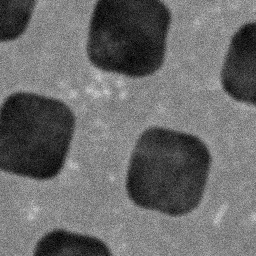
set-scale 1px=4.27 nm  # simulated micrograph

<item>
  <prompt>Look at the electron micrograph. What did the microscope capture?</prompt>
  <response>holes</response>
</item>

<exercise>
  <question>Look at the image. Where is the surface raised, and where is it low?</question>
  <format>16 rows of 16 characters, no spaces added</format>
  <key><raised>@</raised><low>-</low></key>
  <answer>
--@@@@----@@@@@@
--@@@@-----@@@@-
-@@@@-----@@@@--
@@@@@-----@@@@--
@@@@@@@---@@@@--
@@@@@@@@@@@@@@--
----@@@@@@@@@@@-
-----@@@@@@@@@@@
-----@@@@---@@@@
----@@@@-----@@@
----@@@@-----@@@
@@@@@@@@-----@@@
@@@@@@@@-----@@@
@@@@@@@@@@@@@@@@
@@@-@@@@@@@@@@@@
@@-----@@@@@@@@@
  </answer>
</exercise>